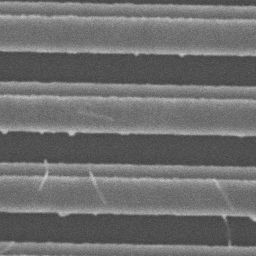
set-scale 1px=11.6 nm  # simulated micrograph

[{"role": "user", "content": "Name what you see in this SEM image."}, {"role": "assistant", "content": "lines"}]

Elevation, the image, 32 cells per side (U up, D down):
UUUUUUUUUUUUDDUUUDDDDDDDDDDDDDDD
UUUUUUUUUUUUUUUUUUUUUUUUUUUUUUUU
UUUUUUUUUUUUUUUUUUUUUUUUUUUUUUUU
UUUUUUUUUUUUUUUUUUUUUUUUUUUUUUUU
UUUUUUUUUUUUUUUUUUUUUUUUUUUUUUUU
UUUUUUUUUUUUUUUUUUUUUUUUUUUUUUUU
DDDDDDDDUUDUUUUUUUUUUUUUUUUUUUUU
DDDDDDDDDDDDDDDDDDDDDDDDDDDDDDDD
DDDDDDDDDDDDDDDDDDDDDDDDDDDDDDDD
DDDDDDDDDDDDDDDDDDDDDDDDDDDDDDDD
UUUUUUUUUUUUDDDDDDDDDDDDDDDDDDDD
UUUUUUUUUUUUUUUUUUUUUUUUUUUUUUUU
UUUUUUUUUUUUUUUUUUUUUUUUUUUUUUUU
UUUUUUUUUUUUUUUUUUUUUUUUUUUUUUUU
UUUUUUUUUUUUUUUUUUUUUUUUUUUUUUUU
UUUUUUUUUUUUUUUUUUUUUUUUUUUUUUUU
UDDDDUUDUUUUUUUUUUUUUUUUUUUUUUUU
DDDDDDDDDDDDDDDDDDDDDDDDDDDDDDDD
DDDDDDDDDDDDDDDDDDDDDDDDDDDDDDDD
DDDDDDDDDDDDDDDDDDDDDDDDDDDDDDDD
UDUDDUDDDDDDDDDDDDDDDDDDDDDDDDDD
UUUUUUUUUUUUUUUUUUUUUUUUUUUUUUUU
UUUUUUUUUUUUUUUUUUUUUUUUUUUUUUUU
UUUUUUUUUUUUUUUUUUUUUUUUUUUUUUUU
UUUUUUUUUUUUUUUUUUUUUUUUUUUUUUUU
UUUUUUUUUUUUUUUUUUUUUUUUUUUUUUUU
DDDDDDDUUUUUUUUUUUUUUUUUUUUUUUUU
DDDDDDDDDDDDDDDDDDDDDDDDDDDDDDDD
DDDDDDDDDDDDDDDDDDDDDDDDDDDDDDDD
DDDDDDDDDDDDDDDDDDDDDDDDDDDDDDDD
UUUUUUUUUDDDDDDDDDDDDDDDDDDDDDDD
UUUUUUUUUUUUUUUUUUUUUUUUUUUUUUUU